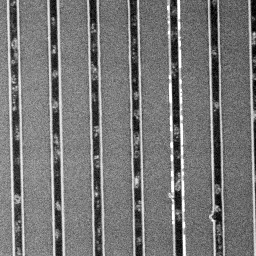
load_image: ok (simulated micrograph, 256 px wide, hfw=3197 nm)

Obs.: parallel lines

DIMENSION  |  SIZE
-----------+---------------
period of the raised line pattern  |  0.501 um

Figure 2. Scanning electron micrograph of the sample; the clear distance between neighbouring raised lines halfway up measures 381 nanometers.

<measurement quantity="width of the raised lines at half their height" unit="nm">123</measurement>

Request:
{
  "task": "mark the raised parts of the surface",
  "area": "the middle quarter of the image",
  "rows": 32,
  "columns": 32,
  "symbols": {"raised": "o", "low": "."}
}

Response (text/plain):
......ooo........oo........oo...
......ooo........oo........oo...
......ooo........oo........oo...
......ooo........oo........oo...
.......oo........oo........oo...
.......oo........oo........oo...
.......oo........oo........oo...
.......oo........oo........oo...
.......oo........oo........oo...
.......oo........oo........oo...
.......oo........oo........oo...
.......oo........oo........oo...
.......oo........oo........oo...
.......oo........oo........oo...
.......oo........oo........oo...
.......oo........oo........oo...
.......oo........oo........oo...
.......oo........oo........oo...
.......oo........oo........oo...
.......oo........oo........oo...
.......oo........oo........oo...
.......oo........oo........oo...
.......oo........oo........oo...
.......oo........ooo.......oo...
.......oo........ooo.......oo...
.......oo........oo........oo...
.......oo........oo........oo...
.......ooo.......oo........oo...
.......ooo.......oo........oo...
.......ooo.......oo........ooo..
.......ooo.......oo........ooo..
.......ooo.......oo........ooo..